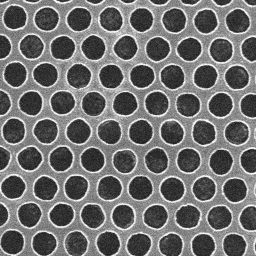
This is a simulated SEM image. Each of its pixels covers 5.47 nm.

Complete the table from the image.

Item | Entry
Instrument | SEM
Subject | a regular array of holes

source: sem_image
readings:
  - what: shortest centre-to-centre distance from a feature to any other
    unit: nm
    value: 170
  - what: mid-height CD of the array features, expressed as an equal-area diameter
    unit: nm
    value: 134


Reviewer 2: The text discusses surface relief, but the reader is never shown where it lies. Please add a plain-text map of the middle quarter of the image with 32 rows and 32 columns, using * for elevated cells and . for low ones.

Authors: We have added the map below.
**...*****...*****...*****...***
*......**.....***.....**.....***
*......**......*.......*......**
*......**......*.......*......**
*.....***......**.....**......**
**....****....****...****....***
***************************.****
..****...****....****....*****..
...**.....***.....**......**....
...*.......*......**......**....
...*......**......**......**....
..***.....**......***.....**....
.*****...****....****....****...
********************************
**....****...*****...****...****
*.....***.....***.....**......**
*......*......**......**......**
*......*......**......**......**
*.....***.....**......**......**
**...*****...****....****....***
********************************
..***....******.******...****...
..**......***.....***.....***...
..**......**......**......**....
..**......**......**......**....
..**......**......***.....**....
.****....****....****....****...
***************.****************
*....****....****....*****..****
......***.....***.....***.....**
......**.......*......**......**
......**......**......**......**